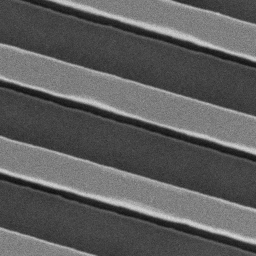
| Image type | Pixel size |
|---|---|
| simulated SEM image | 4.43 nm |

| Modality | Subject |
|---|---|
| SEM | lines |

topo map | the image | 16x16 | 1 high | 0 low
0000011111110000
0000000011111111
0000000000001111
1110000000000001
1111110000000000
0011111111000000
0000001111111000
0000000001111111
0000000000001111
1111000000000001
1111111000000000
0001111111000000
0000001111111100
0000000000111111
1000000000000111
1111000000000000